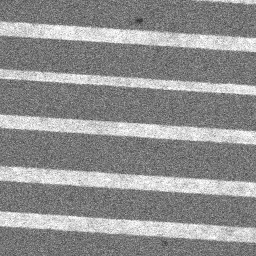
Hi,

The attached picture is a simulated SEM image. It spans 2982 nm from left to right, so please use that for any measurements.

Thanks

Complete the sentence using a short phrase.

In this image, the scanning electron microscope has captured parallel lines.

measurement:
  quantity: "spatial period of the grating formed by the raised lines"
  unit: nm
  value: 554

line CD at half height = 151 nm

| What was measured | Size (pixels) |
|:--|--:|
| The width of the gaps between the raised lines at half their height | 34.9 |